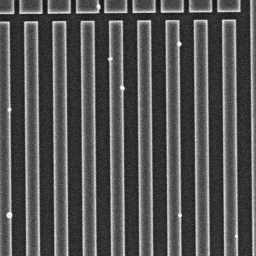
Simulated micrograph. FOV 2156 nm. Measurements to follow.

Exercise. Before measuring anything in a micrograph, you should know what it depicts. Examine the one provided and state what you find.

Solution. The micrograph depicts groups of lines, slits or small figures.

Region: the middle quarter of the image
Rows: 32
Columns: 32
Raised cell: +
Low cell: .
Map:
.....++....++++....+++....+++...
.....++....++++....+++....+++...
+....++....++++....+++....+++...
+....++.....+++....+++....+++...
+....++.....+++....+++....+++...
+....++.....+++....+++....+++...
+....++.....+++....+++....+++...
+....++.....+++....+++....+++...
+....++.....+++....+++....+++...
+....+++....+++....+++....+++...
+....+++....+++....+++....+++...
+....+++....+++....+++....+++...
+....+++....+++....+++....+++...
+....+++....+++....+++....+++...
+....+++....+++....+++....+++...
+....+++....+++....+++....+++...
+....+++....+++....+++....+++...
+....+++....+++....+++....+++...
+....+++....+++....+++....+++...
+....+++....+++....+++....+++...
+....+++....+++....+++....+++...
+....+++....+++....+++....+++...
+....+++....+++....+++....+++...
+....+++....+++....+++....+++...
+....+++....+++....+++....+++...
+....+++....+++....+++....+++...
+....+++....+++....+++....+++...
+....+++....+++....+++....+++...
+....+++....+++....+++....+++...
+....+++....+++....+++....+++...
+....+++....+++....+++....+++...
+....+++....+++....+++....+++...